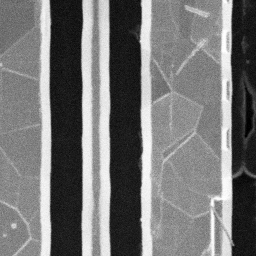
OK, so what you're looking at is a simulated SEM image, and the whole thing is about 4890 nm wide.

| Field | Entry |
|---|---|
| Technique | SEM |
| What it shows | wiring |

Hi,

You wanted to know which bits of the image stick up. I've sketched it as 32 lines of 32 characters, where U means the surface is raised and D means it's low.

UUUUUUDDDDDUUDDDDDUUUUUUUUUUDDDD
UUUUUUDDDDDUUDDDDDUUUUUUUUUUDDDD
UUUUUUDDDDDUUDDDDDUUUUUUUUUUDDDD
UUUUUUDDDDDUUDDDDDUUUUUUUUUUDDDD
UUUUUUDDDDDUUDDDDDUUUUUUUUUUDDDD
UUUUUUDDDDDUUDDDDDUUUUUUUUUUDDDD
UUUUUUDDDDDUUDDDDDUUUUUUUUUUDDDD
UUUUUUDDDDDUUDDDDDUUUUUUUUUUDDDD
UUUUUUDDDDDUUDDDDDUUUUUUUUUUDDDD
UUUUUUDDDDDUUDDDDDUUUUUUUUUUDDDD
UUUUUUDDDDDUUDDDDDUUUUUUUUUUDDDD
UUUUUUDDDDDUUDDDDDUUUUUUUUUUDDDD
UUUUUUDDDDDUUDDDDDUUUUUUUUUUDDDD
UUUUUUDDDDDUUDDDDDUUUUUUUUUUDDDD
UUUUUUDDDDDUUDDDDDUUUUUUUUUUDDDD
UUUUUUDDDDDUUDDDDDUUUUUUUUUUDDDD
UUUUUUDDDDDUUDDDDDUUUUUUUUUUDDDD
UUUUUUDDDDDUUDDDDDUUUUUUUUUUDDDD
UUUUUUDDDDDUUDDDDDUUUUUUUUUUDDDD
UUUUUUDDDDDUUDDDDDUUUUUUUUUUDDDD
UUUUUUDDDDDUUDDDDDUUUUUUUUUUDDDD
UUUUUUDDDDDUUDDDDDUUUUUUUUUUDDDD
UUUUUUDDDDDUUDDDDDUUUUUUUUUUDDDD
UUUUUUDDDDDUUDDDDDUUUUUUUUUUDDDD
UUUUUUDDDDDUUDDDDDUUUUUUUUUUDDDD
UUUUUUDDDDDUUDDDDDUUUUUUUUUDDDDD
UUUUUUDDDDDUUDDDDDUUUUUUUUUDDDDD
UUUUUUDDDDDUUDDDDDUUUUUUUUUDDDDD
UUUUUUDDDDDUUDDDDDUUUUUUUUUDDDDD
UUUUUUDDDDDUUDDDDDUUUUUUUUUDDDDD
UUUUUUDDDDDUUDDDDDUUUUUUUUUDDDDD
UUUUUUDDDDDUUDDDDDDUUUUUUUUDDDDD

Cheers